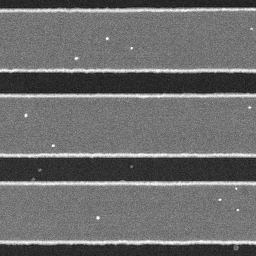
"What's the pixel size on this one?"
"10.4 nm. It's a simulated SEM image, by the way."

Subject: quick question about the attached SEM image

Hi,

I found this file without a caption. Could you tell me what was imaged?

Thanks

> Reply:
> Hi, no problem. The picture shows lines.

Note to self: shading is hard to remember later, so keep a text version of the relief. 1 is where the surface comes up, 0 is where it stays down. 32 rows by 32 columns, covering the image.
00000000000000000000000000000000
11111111111111111111111111111111
11111111111111111111111111111111
11111111111111111111111111111111
11111111111111111111111111111111
11111111111111111111111111111111
11111111111111111111111111111111
11111111111111111111111111111111
11111111111111111111111111111111
00000000000000000000000000000000
00000000000000000000000000000000
00000000000000000000000000000000
11111111111111111111111111111111
11111111111111111111111111111111
11111111111111111111111111111111
11111111111111111111111111111111
11111111111111111111111111111111
11111111111111111111111111111111
11111111111111111111111111111111
11111111111111111111111111111111
00000000000000000000000000000000
00000000000000000000000000000000
00000000000000000000000000000000
11111111111111111111111111111111
11111111111111111111111111111111
11111111111111111111111111111111
11111111111111111111111111111111
11111111111111111111111111111111
11111111111111111111111111111111
11111111111111111111111111111111
00000000000000000000000000000000
00000000000000000000000000000000